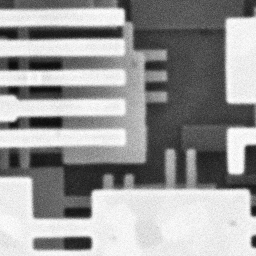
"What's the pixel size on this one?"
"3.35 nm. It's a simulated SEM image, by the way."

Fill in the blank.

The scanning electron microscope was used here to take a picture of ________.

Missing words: wiring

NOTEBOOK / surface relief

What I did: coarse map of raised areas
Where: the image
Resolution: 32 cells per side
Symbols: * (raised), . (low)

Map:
................................
****************................
****************.............***
............................****
............................****
****************............****
****************............****
............................****
............................****
****************............****
***************.............****
............................****
**..........................****
****************................
*****...........................
................................
****************............****
****************............****
............................***.
............................**..
.............................*..
.............................*..
****............................
****............................
****........*******************.
****........*******************.
****........*******************.
********************************
********************************
********************************
****........*******************.
********************************